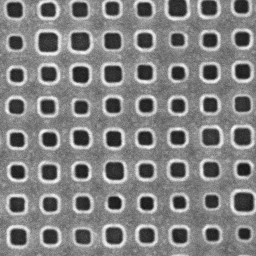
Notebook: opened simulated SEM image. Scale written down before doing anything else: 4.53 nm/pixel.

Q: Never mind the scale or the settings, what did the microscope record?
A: a regular array of holes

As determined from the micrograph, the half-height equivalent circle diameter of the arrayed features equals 75.5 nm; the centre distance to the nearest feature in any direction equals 0.144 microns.